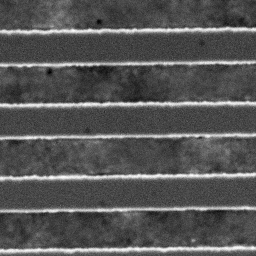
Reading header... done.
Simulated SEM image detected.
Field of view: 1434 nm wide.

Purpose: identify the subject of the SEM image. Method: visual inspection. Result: lines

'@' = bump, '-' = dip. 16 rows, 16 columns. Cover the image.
----------------
----------------
@@@@@@@@@@@@@@@@
@@@@@@@@@@@@@@@@
----------------
----------------
--@-@@@@@@@@@@@@
@@@@@@@@@@@@@@@@
@@@@@@@@@@@@@@--
----------------
----------------
@@@@@@@@@@@@@@@@
@@@@@@@@@@@@@@@@
----------------
----------------
--------------@@